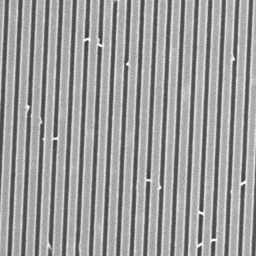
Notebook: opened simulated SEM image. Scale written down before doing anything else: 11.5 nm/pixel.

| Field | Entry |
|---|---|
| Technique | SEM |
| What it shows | parallel lines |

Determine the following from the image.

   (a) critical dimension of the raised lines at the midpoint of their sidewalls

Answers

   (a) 100 nanometers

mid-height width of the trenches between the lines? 0.0502 um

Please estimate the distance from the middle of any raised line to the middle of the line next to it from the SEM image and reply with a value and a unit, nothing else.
0.155 microns